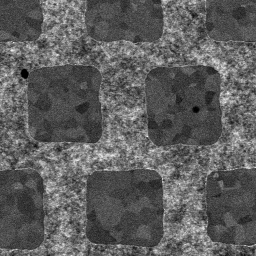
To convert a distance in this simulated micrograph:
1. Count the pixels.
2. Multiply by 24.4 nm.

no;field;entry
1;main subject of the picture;raised bodies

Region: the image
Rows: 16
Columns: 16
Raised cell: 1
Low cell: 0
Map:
1110011111000111
1110011111000111
1100001111000111
0000000000000000
0011110001111100
0011110001111100
0011110001111100
0011110001111100
0011110001111100
0000000000000000
0000000000000001
1110011111000111
1110011111000111
1110011111000111
1110011111000111
1100000000000000